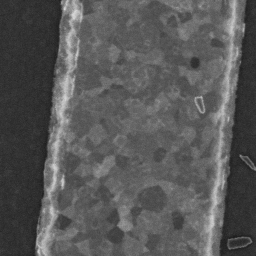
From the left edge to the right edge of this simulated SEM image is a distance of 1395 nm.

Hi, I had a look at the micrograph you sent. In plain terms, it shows one or a few lines or trenches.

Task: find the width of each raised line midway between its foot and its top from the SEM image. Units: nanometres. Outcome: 876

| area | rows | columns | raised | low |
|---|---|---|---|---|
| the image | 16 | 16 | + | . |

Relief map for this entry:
.....++++++++++.
.....++++++++++.
....++++++++++..
....++++++++++..
....++++++++++..
....++++++++++..
....++++++++++..
....++++++++++..
....++++++++++..
...+++++++++++..
...+++++++++++..
...+++++++++++..
...++++++++++...
...++++++++++...
...++++++++++...
...++++++++++...